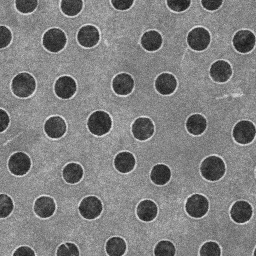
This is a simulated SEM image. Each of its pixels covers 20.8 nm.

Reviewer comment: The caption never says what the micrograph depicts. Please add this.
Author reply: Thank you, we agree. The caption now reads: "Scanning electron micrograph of a regular array of holes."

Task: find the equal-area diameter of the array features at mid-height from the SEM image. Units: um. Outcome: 0.489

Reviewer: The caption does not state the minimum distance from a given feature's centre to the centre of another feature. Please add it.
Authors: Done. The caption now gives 848 nm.